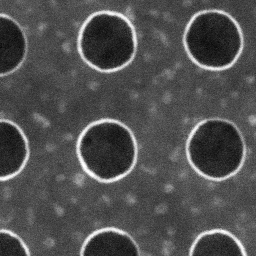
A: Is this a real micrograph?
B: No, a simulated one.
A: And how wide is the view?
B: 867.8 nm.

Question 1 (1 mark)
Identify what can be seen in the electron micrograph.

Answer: raised bodies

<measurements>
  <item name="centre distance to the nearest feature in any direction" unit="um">0.364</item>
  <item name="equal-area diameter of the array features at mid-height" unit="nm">203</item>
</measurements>